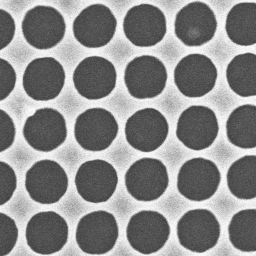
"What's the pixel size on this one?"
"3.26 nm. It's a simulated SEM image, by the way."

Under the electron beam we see a regular array of holes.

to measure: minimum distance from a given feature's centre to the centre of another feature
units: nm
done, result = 164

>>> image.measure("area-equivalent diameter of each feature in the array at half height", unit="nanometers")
142